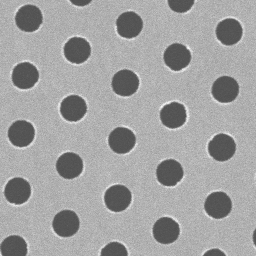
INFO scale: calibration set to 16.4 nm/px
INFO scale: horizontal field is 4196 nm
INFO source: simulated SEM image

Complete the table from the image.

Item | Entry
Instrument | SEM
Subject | a regular array of holes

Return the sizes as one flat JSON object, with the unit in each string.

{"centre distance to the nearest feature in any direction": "943 nanometers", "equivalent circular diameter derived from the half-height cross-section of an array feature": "458 nm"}